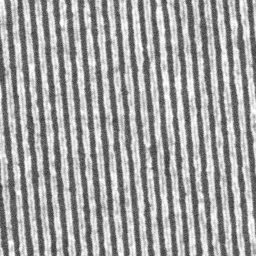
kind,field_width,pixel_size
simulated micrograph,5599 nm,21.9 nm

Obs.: parallel lines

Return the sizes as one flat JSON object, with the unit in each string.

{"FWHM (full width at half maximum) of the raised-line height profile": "3.49 pixels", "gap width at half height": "188 nm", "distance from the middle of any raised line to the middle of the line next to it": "264 nanometers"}